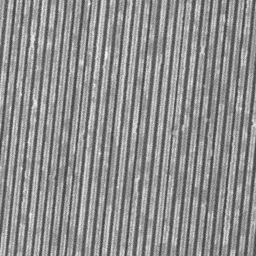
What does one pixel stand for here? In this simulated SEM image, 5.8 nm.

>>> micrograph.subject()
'parallel lines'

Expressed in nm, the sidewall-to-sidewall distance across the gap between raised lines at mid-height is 22.4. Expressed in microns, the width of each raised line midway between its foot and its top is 0.0274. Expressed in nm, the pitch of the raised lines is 49.2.